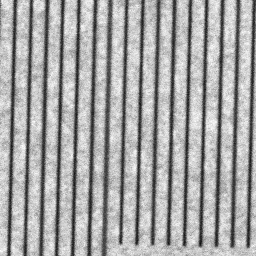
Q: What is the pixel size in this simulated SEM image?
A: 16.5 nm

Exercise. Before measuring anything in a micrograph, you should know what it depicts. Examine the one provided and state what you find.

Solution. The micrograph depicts parallel lines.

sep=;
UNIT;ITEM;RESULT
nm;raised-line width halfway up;198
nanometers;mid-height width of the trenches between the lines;55.6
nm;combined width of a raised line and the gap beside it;263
